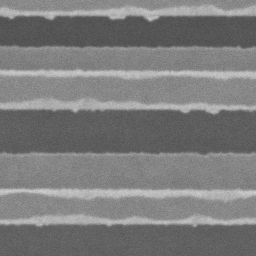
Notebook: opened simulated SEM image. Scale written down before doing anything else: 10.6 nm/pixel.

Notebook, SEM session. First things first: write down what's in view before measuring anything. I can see lines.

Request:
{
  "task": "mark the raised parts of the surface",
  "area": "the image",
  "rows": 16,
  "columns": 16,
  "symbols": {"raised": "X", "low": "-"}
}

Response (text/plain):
XXXXXXXXXXXXXXXX
----------------
----------------
XXXXXXXXXXXXXXXX
XXXXXXXXXXXXXXXX
XXXXXXXXXXXXXXXX
XXXXXXXXXXXXXXXX
----------------
----------------
----------------
XXXXXXXXXXXXXXXX
XXXXXXXXXXXXXXXX
XXXXXXXXXXXXXXXX
XXXXXXXXXXXXXXXX
----------------
----------------